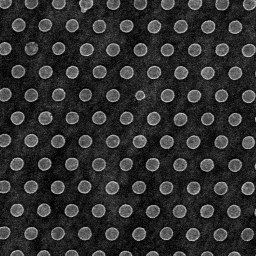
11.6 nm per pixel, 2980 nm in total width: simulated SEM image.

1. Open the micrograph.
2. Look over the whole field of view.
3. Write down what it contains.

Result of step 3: a regular array of raised bodies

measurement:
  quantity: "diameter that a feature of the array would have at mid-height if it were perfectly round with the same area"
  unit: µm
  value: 0.151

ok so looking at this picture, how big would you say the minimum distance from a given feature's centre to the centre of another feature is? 308 nm